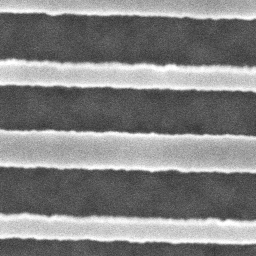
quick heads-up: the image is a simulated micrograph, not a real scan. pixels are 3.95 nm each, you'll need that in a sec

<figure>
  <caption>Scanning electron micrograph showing lines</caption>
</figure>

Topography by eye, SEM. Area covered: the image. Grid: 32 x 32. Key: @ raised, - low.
@@@@@@@@@@@@@@@@@@@@@@@@@@@@@@@@
-@@@@@@@@@@@@@@@@@@@@@@@@@@@@@@@
--------------------------------
--------------------------------
--------------------------------
--------------------------------
--------------------------------
--------------------------------
@@@@@@@@@@@@@@@@@@@@@@@@@@@@@---
@@@@@@@@@@@@@@@@@@@@@@@@@@@@@@@@
@@@@@@@@@@@@@@@@@@@@@@@@@@@@@@@@
--------------------------------
--------------------------------
--------------------------------
--------------------------------
--------------------------------
@@@@@@@@------------------------
@@@@@@@@@@@@@@@@@@@@@@@@@@@@@@@@
@@@@@@@@@@@@@@@@@@@@@@@@@@@@@@@@
@@@@@@@@@@@@@@@@@@@@@@@@@@@@@@@@
@@@@@@@@@@@@@@@@@@@@@@@@@@@@@@@@
----------------------------@-@@
--------------------------------
--------------------------------
--------------------------------
--------------------------------
--------------------------------
@@@@@@@@@@@@@@@@@@@@@-----@-----
@@@@@@@@@@@@@@@@@@@@@@@@@@@@@@@@
@@@@@@@@@@@@@@@@@@@@@@@@@@@@@@@@
------------------------------@-
--------------------------------